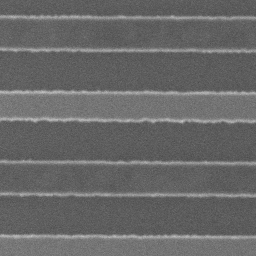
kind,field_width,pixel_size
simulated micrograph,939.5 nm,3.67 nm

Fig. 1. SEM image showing lines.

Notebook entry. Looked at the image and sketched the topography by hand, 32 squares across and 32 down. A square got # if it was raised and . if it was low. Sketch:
................................
................................
################################
################################
################################
################################
................................
................................
................................
................................
................................
###########.##..#.#.............
################################
################################
################################
................................
................................
................................
................................
................................
################################
################################
################################
################################
....................#..###.###.#
................................
................................
................................
................................
#################.########......
################################
################################